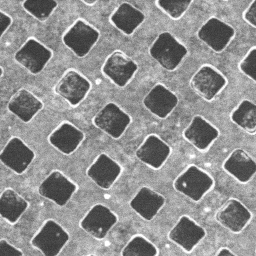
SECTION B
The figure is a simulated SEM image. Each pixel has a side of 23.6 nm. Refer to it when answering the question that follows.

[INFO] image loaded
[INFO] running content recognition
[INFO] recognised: a regular array of raised bodies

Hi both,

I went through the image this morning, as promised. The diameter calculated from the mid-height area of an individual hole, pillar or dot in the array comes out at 33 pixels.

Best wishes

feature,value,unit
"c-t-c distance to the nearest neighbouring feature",1190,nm